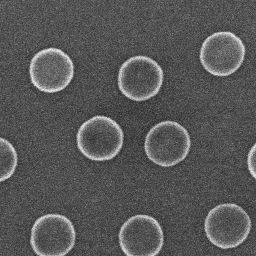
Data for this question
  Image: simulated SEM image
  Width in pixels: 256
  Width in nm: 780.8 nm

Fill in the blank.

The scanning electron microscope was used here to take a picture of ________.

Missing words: raised bodies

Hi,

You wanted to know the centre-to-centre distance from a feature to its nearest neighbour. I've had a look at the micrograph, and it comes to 0.236 um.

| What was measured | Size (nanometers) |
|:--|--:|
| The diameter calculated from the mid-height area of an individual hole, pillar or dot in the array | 133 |